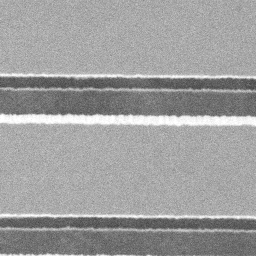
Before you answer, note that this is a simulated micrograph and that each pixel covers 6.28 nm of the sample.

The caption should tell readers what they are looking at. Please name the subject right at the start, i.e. lines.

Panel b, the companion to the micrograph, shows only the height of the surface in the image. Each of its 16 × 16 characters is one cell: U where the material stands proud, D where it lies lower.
UUUUUUUUUUUUUUUU
UUUUUUUUUUUUUUUU
UUUUUUUUUUUUUUUU
UUUUUUUUUUUUUUUU
UUUUUUUUUUUUUUUU
DDDDDDDDDDDDDDDD
DDDDDDDDDDDDDDDD
UUUUUUUUUUUUUUUU
UUUUUUUUUUUUUUUU
UUUUUUUUUUUUUUUU
UUUUUUUUUUUUUUUU
UUUUUUUUUUUUUUUU
UUUUUUUUUUUUUUUU
DDDUUUUUUUUUUUUU
DDDDDDDDDDDDDDDD
DDDDDDDDDDDDDDDD